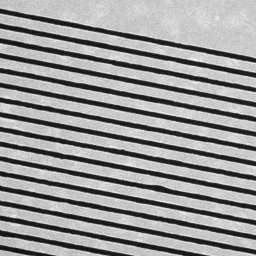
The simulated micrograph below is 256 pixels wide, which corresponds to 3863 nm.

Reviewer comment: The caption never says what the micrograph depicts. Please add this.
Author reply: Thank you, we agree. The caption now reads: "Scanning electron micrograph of parallel lines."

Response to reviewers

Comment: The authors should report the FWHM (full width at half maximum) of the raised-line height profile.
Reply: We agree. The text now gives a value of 8.71 px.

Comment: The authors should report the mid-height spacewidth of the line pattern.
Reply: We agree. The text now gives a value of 88.9 nm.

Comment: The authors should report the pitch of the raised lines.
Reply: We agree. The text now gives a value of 0.219 microns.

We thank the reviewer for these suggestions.